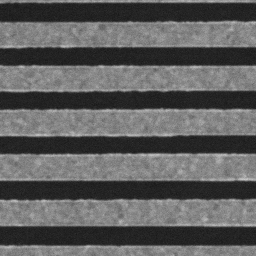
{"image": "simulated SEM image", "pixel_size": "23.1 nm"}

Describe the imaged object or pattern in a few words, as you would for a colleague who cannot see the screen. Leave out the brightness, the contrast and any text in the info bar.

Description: lines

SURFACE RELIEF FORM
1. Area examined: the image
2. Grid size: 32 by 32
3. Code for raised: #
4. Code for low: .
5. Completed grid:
................................
................................
................................
################################
################################
################################
................................
................................
################################
################################
################################
................................
................................
................................
################################
################################
################################
................................
................................
################################
################################
################################
................................
................................
................................
################################
################################
################################
................................
................................
................................
################################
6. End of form